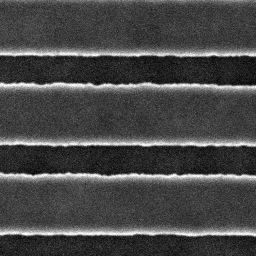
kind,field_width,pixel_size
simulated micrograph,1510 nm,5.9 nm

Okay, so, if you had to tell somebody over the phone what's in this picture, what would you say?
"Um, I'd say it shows lines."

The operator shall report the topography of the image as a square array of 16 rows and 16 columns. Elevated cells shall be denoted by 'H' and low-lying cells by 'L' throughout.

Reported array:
HHHHHHHHHHHHHHHH
HHHHHHHHHHHHHHHH
HHHHHHHHHHHHHHHH
LLLLLLLLLLLLLLLL
LLLLLLLLLLLLLLLL
HHHHHHHHHHHHHHHH
HHHHHHHHHHHHHHHH
HHHHHHHHHHHHHHHH
HHHHHHHHHHHHHHHH
LLLLLLLLLLLLLLLL
LLLLLLLLLLLLLLLL
HHHHHHHHHHHHHHHH
HHHHHHHHHHHHHHHH
HHHHHHHHHHHHHHHH
HHHHHHHHHHHHHHHH
LLLLLLLLLLLLLLLL